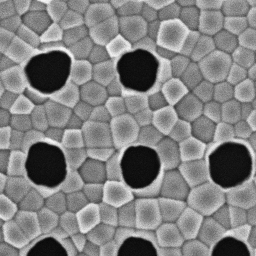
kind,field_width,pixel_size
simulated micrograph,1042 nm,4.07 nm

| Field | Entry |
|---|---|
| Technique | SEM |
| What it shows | holes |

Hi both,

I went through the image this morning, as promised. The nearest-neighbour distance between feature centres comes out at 367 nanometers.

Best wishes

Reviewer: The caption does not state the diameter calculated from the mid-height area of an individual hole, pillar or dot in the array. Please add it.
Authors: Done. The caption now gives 0.177 um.